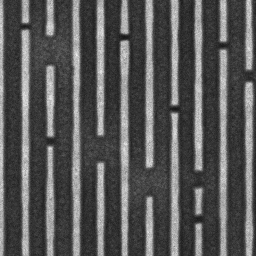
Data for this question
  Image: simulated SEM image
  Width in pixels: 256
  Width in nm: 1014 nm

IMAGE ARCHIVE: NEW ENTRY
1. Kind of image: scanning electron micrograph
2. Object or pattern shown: parallel lines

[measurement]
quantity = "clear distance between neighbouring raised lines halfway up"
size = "0.0654 micrometres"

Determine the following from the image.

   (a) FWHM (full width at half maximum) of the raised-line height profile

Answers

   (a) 34.2 nm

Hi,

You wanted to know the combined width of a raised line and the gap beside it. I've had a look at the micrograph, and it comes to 98.4 nm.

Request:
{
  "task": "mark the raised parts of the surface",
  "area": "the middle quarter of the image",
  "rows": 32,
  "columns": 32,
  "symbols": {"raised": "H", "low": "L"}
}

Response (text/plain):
LLHHLLLLHHLLLLHHLLLLHHLLLLLHLLLL
LLHHLLLLHHLLLLHHLLLLHHLLLLLHLLLL
LLHHLLLLHHLLLLHHLLLLHHLLLLLHLLLL
LLHHLLLLHHLLLLHHLLLLHHLLLLLHLLLL
LLHHLLLLHHLLLLHHLLLLHHLLLLLHHLLL
LLHHLLLLHHLLLLHHLLLLHHLLLLLHHLLL
LLHHLLLLHHLLLLHHLLLLHHLLLLLHHLLL
LLHHLLLLHHLLLLHHLLLLHHLLLLLHHLLL
LLHHLLLLHHLLLLHHLLLLHHLLLLLHHLLL
LLHHLLLLHHLLLLHHLLLLHHLLLLLHHLLL
LLHHLLLLHHLLLLHHLLLLHHLLLLLLLLLL
LLHHLLLLHHLLLLHHLLLLHHLLLLLLLLLL
LLHHLLLLHHLLLLHHLLLLHHLLLLLHHLLL
LLHHLLLLHHLLLLHHLLLLHHLLLLLHLLLL
LLHHLLLLHHLLLLHHLLLLHHLLLLLHHLLL
LLHHLLLLHHLLLLHHLLLLHHLLLLLHHLLL
LLHHLLLLHHLLLLHHLLLLHHLLLLLHHLLL
LLHHLLLLHHLLLLHHLLLLHHLLLLLHHLLL
LLHHLLLLLLLLLLHHLLLLHHLLLLLHHLLL
LLHHLLLLLLLLLLHHLLLLHHLLLLLHHLLL
LLHHLLLLLLLLLLHHLLLLHHLLLLLHHLLL
LLHHLLLLLLLLLLHHLLLLHHLLLLLHHLLL
LLHHLLLLLLLLLLHHLLLLHHLLLLLHHLLL
LLHHLLLLLLLLLLHHLLLLLHLLLLLHHLLL
LLHHLLLLLLLLLLHHLLLLHHLLLLLHHLLL
LLHHLLLLHHLLLLHHLLLLHHLLLLLHHLLL
LLHHLLLLHHLLLLHHLLLLLLLLLLLHHLLL
LLHHLLLLHHLLLLHHLLLLLLLLLLLHHLLL
LLHHLLLLHHLLLLHHLLLLLLLLLLLHHLLL
LLHHLLLLHHLLLLHHLLLLLLLLLLLHHLLL
LLHHLLLLHHLLLLHHLLLLLLLLLLLHHLLL
LLHHLLLLHHLLLLHHLLLLLLLLLLLHHLLL